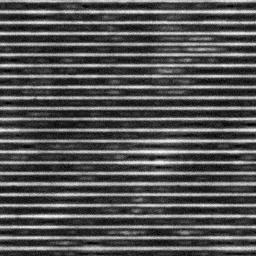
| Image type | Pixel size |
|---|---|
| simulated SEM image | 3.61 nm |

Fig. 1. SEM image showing parallel lines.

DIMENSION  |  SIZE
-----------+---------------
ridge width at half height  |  7.2 nanometres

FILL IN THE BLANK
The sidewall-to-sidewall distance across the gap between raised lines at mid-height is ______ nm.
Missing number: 32